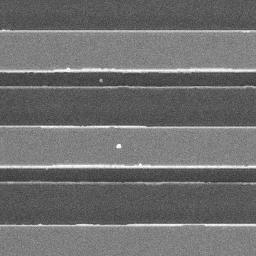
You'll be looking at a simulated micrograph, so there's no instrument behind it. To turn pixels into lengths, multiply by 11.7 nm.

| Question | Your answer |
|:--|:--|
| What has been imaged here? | lines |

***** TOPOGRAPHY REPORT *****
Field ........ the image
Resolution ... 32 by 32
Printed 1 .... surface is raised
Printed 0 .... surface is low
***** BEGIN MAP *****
00000000000000000000000000000000
00000000000000000000000000000000
00000000000000000000000000000000
00000000000000000000000000000000
11111111111111111111111111111111
11111111111111111111111111111111
11111111111111111111111111111111
11111111111111111111111111111111
11111111111111111111111111111111
00000000000000000000000000000000
00000000000000000000000000000000
00000000000000000000000000000000
00000000000000000000000000000000
00000000000000000000000000000000
00000000000000000000000000000000
00000000000000000000000000000000
11111111111111111111111111111111
11111111111111111111111111111111
11111111111111111111111111111111
11111111111111111111111111111111
11111111111111111111111111111111
00000000000000000000000000000000
00000000000000000000000000000000
00000000000000000000000000000000
00000000000000000000000000000000
00000000000000000000000000000000
00000000000000000000000000000000
00000000000000000000000000000000
11111111111111111111111111111111
11111111111111111111111111111111
11111111111111111111111111111111
11111111111111111111111111111111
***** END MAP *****